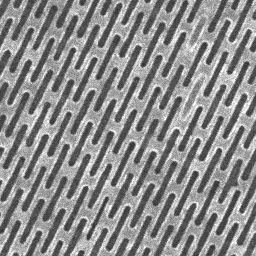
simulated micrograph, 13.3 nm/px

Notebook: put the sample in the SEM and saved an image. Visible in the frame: a regular array of holes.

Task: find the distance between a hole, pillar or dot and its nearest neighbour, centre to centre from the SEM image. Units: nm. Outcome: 308